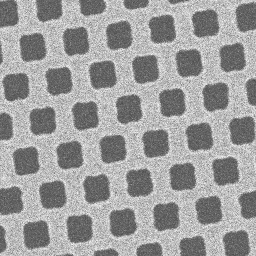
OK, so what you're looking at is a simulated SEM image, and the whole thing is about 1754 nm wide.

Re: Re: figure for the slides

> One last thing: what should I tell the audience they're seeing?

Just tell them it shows a regular array of holes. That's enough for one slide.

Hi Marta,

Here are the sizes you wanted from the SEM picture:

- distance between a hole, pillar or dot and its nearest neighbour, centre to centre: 293 nm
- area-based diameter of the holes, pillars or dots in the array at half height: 199 nanometres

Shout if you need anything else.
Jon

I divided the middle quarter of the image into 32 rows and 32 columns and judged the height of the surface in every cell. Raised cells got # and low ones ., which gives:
#######......####......#####....
..####.......####.......####....
..####.......####.......#####...
..#####......####.......########
..#####......#####.....#########
..#####......###################
..#######################....###
.#######################......##
#############......#####......##
######..#####......#####......##
##......#####......#####......##
##......#####......#####.......#
##.......####.......####......##
##.......####......#############
##.......#####....##############
##......#######################.
###..#################...#####..
####################......####..
##########.....####.......#####.
....#####......#####......#####.
....#####......#####......#####.
.....####.......####......######
....#####.......####......######
.....####......#################
.....#####...###################
....#######################.....
#################....#####......
#########.######......####......
######.....####.......#####.....
#####......#####......#####.....
#####......#####......#####.....
#####......#####......#####...#.